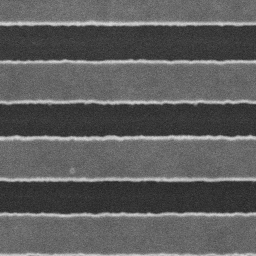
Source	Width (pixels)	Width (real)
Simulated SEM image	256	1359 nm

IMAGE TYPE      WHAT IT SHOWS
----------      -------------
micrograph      lines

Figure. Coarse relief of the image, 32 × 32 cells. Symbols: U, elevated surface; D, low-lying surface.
UUUUUUUUUUUUUUUUUUUUUUUUUUUUUUUU
UUUUUUUUUUUUUUUUUUUUUUUUUUUUUUUU
UUUUUUUUUUUUUUUUUUUUUUUUUUUUUUUU
DDDDDDDDDDDDDDDDDDDDDDDDDDDDDDDD
DDDDDDDDDDDDDDDDDDDDDDDDDDDDDDDD
DDDDDDDDDDDDDDDDDDDDDDDDDDDDDDDD
DDDDDDDDDDDDDDDDDDDDDDDDDDDDDDDD
DDDDDDDDDDDDDDDDDDDDDDDDDDDDDDDD
UUUUUUUUUUUUUUUUUUUUUUUUUUUUUUUU
UUUUUUUUUUUUUUUUUUUUUUUUUUUUUUUU
UUUUUUUUUUUUUUUUUUUUUUUUUUUUUUUU
UUUUUUUUUUUUUUUUUUUUUUUUUUUUUUUU
UUUUUUUUUUUUUUUUUUUUUUUUUUUUUUUU
DDDDDDDDDDDDDDDDDDDDDDDDDDDDDDDD
DDDDDDDDDDDDDDDDDDDDDDDDDDDDDDDD
DDDDDDDDDDDDDDDDDDDDDDDDDDDDDDDD
DDDDDDDDDDDDDDDDDDDDDDDDDDDDDDDD
UUUUUUUUUUUUUUUUUUUUUUUUUUUUUUUU
UUUUUUUUUUUUUUUUUUUUUUUUUUUUUUUU
UUUUUUUUUUUUUUUUUUUUUUUUUUUUUUUU
UUUUUUUUUUUUUUUUUUUUUUUUUUUUUUUU
UUUUUUUUUUUUUUUUUUUUUUUUUUUUUUUU
UUUUUUUUUUUUUUUUUUUUUUUUUUUUUUUU
DDDDDDDDDDDDDDDDDDDDDDDDDDDDDDDD
DDDDDDDDDDDDDDDDDDDDDDDDDDDDDDDD
DDDDDDDDDDDDDDDDDDDDDDDDDDDDDDDD
DDDDDDDDDDDDDDDDDDDDDDDDDDDDDDDD
UUUUUUUUUUUUUUUUUUUUUUUUUUUUUUUU
UUUUUUUUUUUUUUUUUUUUUUUUUUUUUUUU
UUUUUUUUUUUUUUUUUUUUUUUUUUUUUUUU
UUUUUUUUUUUUUUUUUUUUUUUUUUUUUUUU
UUUUUUUUUUUUUUUUUUUUUUUUUUUUUUUU